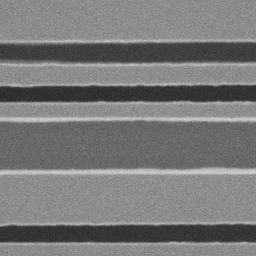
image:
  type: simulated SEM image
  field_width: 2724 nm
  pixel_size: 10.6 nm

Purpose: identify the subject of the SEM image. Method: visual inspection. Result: lines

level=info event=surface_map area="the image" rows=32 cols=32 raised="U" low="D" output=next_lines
UUUUUUUUUUUUUUUUUUUUUUUUUUUUUUUU
UUUUUUUUUUUUUUUUUUUUUUUUUUUUUUUU
UUUUUUUUUUUUUUUUUUUUUUUUUUUUUUUU
UUUUUUUUUUUUUUUUUUUUUUUUUUUUUUUU
UUUUUUUUUUUUUUUUUUUUUUUUUUUUUUUU
DDDDDDDDDDDDDDDDDDDDDDDDDDDDDDDD
DDDDDDDDDDDDDDDDDDDDDDDDDDDDDDDD
DDDDDDDDDDDDDDDDDDDDDDDDDDDDDDDD
UUUUUUUUUUUUUUUUUUUUUUUUUUUUUUUU
UUUUUUUUUUUUUUUUUUUUUUUUUUUUUUUU
UUUUUUUUUUUUUUUUUUUUUUUUUUUUUUUU
DDDDDDDDDDDDDDDDDDDDDDDDDDDDDDDD
DDDDDDDDDDDDDDDDDDDDDDDDDDDDDDDD
UUUUUUUUUUUUUUUUUUUUUUUUUUUUUUUU
UUUUUUUUUUUUUUUUUUUUUUUUUUUUUUUU
DDDDDDDDDDDDDDDDDDDDDDDDDDDDDDDD
DDDDDDDDDDDDDDDDDDDDDDDDDDDDDDDD
DDDDDDDDDDDDDDDDDDDDDDDDDDDDDDDD
DDDDDDDDDDDDDDDDDDDDDDDDDDDDDDDD
DDDDDDDDDDDDDDDDDDDDDDDDDDDDDDDD
DDDDDDDDDDDDDDDDDDDDDDDDDDDDDDDD
DDDDDDDDDDDDDDDDDDDDDDDDDDDDDDDD
UUUUUUUUUUUUUUUUUUUUUUUUUUUUUUUU
UUUUUUUUUUUUUUUUUUUUUUUUUUUUUUUU
UUUUUUUUUUUUUUUUUUUUUUUUUUUUUUUU
UUUUUUUUUUUUUUUUUUUUUUUUUUUUUUUU
UUUUUUUUUUUUUUUUUUUUUUUUUUUUUUUU
UUUUUUUUUUUUUUUUUUUUUUUUUUUUUUUU
DDDDDDDDDDDDDDDDDDDDDDDDDDDDDDDD
DDDDDDDDDDDDDDDDDDDDDDDDDDDDDDDD
UUUUUUUUUUUUUUUUUUUUUUUUUUUUUUUU
UUUUUUUUUUUUUUUUUUUUUUUUUUUUUUUU